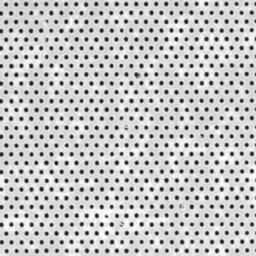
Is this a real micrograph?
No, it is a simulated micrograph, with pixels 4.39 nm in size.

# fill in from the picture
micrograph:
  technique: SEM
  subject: a regular array of holes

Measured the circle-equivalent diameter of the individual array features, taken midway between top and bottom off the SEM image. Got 19.2 nm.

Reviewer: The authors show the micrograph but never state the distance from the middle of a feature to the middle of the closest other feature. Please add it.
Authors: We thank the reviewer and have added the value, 42.8 nanometres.